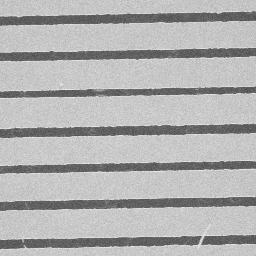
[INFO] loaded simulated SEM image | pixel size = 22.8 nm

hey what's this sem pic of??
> parallel lines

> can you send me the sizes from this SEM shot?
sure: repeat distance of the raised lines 0.85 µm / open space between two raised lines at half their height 214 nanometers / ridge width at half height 638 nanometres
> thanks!